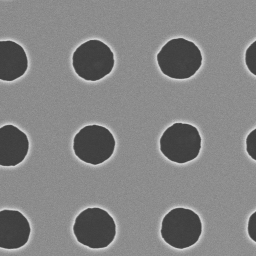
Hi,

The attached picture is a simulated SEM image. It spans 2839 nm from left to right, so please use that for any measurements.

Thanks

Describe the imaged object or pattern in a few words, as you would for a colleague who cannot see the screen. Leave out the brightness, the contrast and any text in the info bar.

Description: holes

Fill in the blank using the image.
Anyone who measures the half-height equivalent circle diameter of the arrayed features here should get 453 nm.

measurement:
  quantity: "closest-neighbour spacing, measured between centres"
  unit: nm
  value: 933